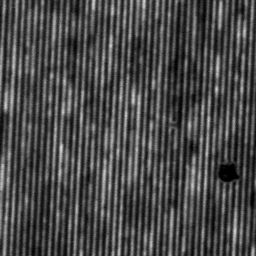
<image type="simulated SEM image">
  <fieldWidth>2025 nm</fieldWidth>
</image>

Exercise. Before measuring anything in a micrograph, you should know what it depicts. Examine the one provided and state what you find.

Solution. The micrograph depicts parallel lines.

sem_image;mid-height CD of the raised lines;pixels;1.74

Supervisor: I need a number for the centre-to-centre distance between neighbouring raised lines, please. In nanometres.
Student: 50.3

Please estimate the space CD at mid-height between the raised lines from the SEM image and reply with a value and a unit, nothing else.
34.6 nm